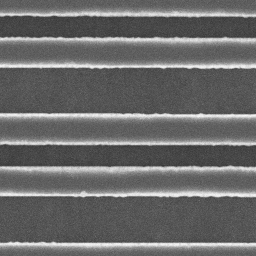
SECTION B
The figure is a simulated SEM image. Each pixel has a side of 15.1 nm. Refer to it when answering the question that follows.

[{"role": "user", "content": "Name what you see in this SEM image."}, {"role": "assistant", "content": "lines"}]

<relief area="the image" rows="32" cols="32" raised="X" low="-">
XXXXXXXXXXXXXXXXXXXXXXXXXXXXXXXX
XXXXXXXXXXXXXXXXXXXXXXXXXXXXXXXX
--------------------------------
--------------------------------
--------------------------------
XXXXXXXXXXXXXXXXXXXXXXXXXXXXXXXX
XXXXXXXXXXXXXXXXXXXXXXXXXXXXXXXX
XXXXXXXXXXXXXXXXXXXXXXXXXXXXXXXX
--------------------------------
--------------------------------
--------------------------------
--------------------------------
--------------------------------
--------------------------------
XXXXXXXXXXXXXXXXXXXXXXXXXXXXXXXX
XXXXXXXXXXXXXXXXXXXXXXXXXXXXXXXX
XXXXXXXXXXXXXXXXXXXXXXXXXXXXXXXX
XXXXXXXXXXXXXXXXXXXXXXXXXXXXXXXX
--------------------------------
--------------------------------
--------------------------------
XXXXXXXXXXXXXXXXXXXXXXXXXXXXXXXX
XXXXXXXXXXXXXXXXXXXXXXXXXXXXXXXX
XXXXXXXXXXXXXXXXXXXXXXXXXXXXXXXX
----------X-------------------X-
--------------------------------
--------------------------------
--------------------------------
--------------------------------
--------------------------------
XXXXXXXXXXXXXXXXXXXXXXXXXXXXX-XX
XXXXXXXXXXXXXXXXXXXXXXXXXXXXXXXX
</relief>